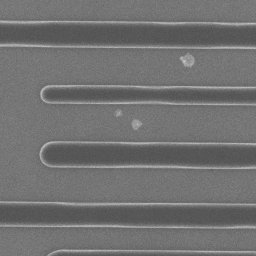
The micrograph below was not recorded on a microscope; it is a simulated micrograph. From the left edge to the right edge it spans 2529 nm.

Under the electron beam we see groups of lines, slits or small figures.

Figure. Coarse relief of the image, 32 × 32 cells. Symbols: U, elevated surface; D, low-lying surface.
DDDDDDDDDDDDDDDDDDDDDDDDDDDDDDDD
DDDDDDDDDDDDDDDDDDDDDDDDDDDDDDDD
DDDDDDDDDDDDDDDDDDDDDDDDDDDDDDDD
UUUUUUUUUUUUUUUUUUUUUUUUUUUUUUUU
UUUUUUUUUUUUUUUUUUUUUUUUUUUUUUUU
UUUUUUUUUUUUUUUUUUUUUUUUUUUUUUUU
DDDDDDDDDDDDDDDDDDDDDDDDDDDDDDDD
DDDDDDDDDDDDDDDDDDDDDDDDDDDDDDDD
DDDDDDDDDDDDDDDDDDDDDDDDDDDDDDDD
DDDDDDDDDDDDDDDDDDDDDDDDDDDDDDDD
DDDDDDDDDDDDDDDDDDDDDDDDDDDDDDDD
DDDDDUUUUUUUUUUUUUUUUUUUUUUUUUUU
DDDDDUUUUUUUUUUUUUUUUUUUUUUUUUUU
DDDDDDDDDDDDDDDDDDDDDDDDDDDDDDDD
DDDDDDDDDDDDDDDDDDDDDDDDDDDDDDDD
DDDDDDDDDDDDDDDDDDDDDDDDDDDDDDDD
DDDDDDDDDDDDDDDDDDDDDDDDDDDDDDDD
DDDDDDDDDDDDDDDDDDDDDDDDDDDDDDDD
DDDDDUUUUUUUUUUUUUUUUUUUUUUUUUUU
DDDDDUUUUUUUUUUUUUUUUUUUUUUUUUUU
DDDDDDUUUUUUUUUUUUUUUUUUUUUUUUUU
DDDDDDDDDDDDDDDDDDDDDDDDDDDDDDDD
DDDDDDDDDDDDDDDDDDDDDDDDDDDDDDDD
DDDDDDDDDDDDDDDDDDDDDDDDDDDDDDDD
DDDDDDDDDDDDDDDDDDDDDDDDDDDDDDDD
UUUUUUUUUUDDUUUUUUUUUUUUUUUUUUDD
UUUUUUUUUUUUUUUUUUUUUUUUUUUUUUUU
UUUUUUUUUUUUUUUUUUUUUUUUUUUUUUUU
DDDDDDDDDDDDDDDDDDDDDDDDDDDDDDDD
DDDDDDDDDDDDDDDDDDDDDDDDDDDDDDDD
DDDDDDDDDDDDDDDDDDDDDDDDDDDDDDDD
DDDDDDDUUUUUUUUUUUUUUUUUUUUUUUUU